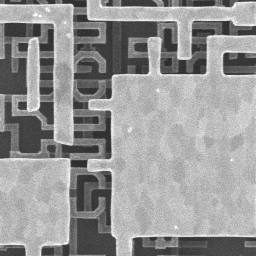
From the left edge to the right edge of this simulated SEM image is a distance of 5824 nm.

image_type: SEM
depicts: wiring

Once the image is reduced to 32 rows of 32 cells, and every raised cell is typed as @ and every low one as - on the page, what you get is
-----------@@----------------@@@
@@@@@@@@@--@@@@@@@@@@@@@@@@@@@@@
@@@@@@@@@--@@@@@@@@@@@@@@@@@@@@@
-------@@-------------@@--------
-------@@-------------@@--------
----@--@@---------@@--@@--@@@@@@
----@--@@---------@@--@@--@@@@@@
---@@--@@----------@------@@----
---@@--@@----------@------@@----
---@@--@@-----@@@@@@@@@@@@@@@@@@
---@@--@@-----@@@@@@@@@@@@@@@@@@
---@@--@@-----@@@@@@@@@@@@@@@@@@
---@@--@@--@@@@@@@@@@@@@@@@@@@@@
---@@--@@--@@@@@@@@@@@@@@@@@@@@@
-------@@-----@@@@@@@@@@@@@@@@@@
-------@@-----@@@@@@@@@@@@@@@@@@
-------@@-----@@@@@@@@@@@@@@@@@@
-------@@-----@@@@@@@@@@@@@@@@@@
--------------@@@@@@@@@@@@@@@@@@
--------------@@@@@@@@@@@@@@@@@@
@@@@@@@@@--@@@@@@@@@@@@@@@@@@@@@
@@@@@@@@@-----@@@@@@@@@@@@@@@@@@
@@@@@@@@@-----@@@@@@@@@@@@@@@@@@
@@@@@@@@@-----@@@@@@@@@@@@@@@@@@
@@@@@@@@@-----@@@@@@@@@@@@@@@@@@
@@@@@@@@@-----@@@@@@@@@@@@@@@@@@
@@@@@@@@@-----@@@@@@@@@@@@@@@@@@
@@@@@@@@@-----@@@@@@@@@@@@@@@@@@
@@@@@@@@@-----@@@@@@@@@@@@@@@@@@
@@@@@@@@@-----@@@@@@@@@@@@@@@@@@
@@@@@@@@-------@----------------
---@@----------@----------------